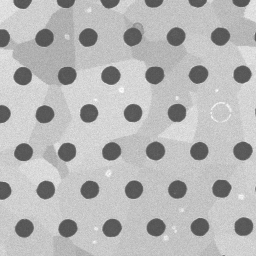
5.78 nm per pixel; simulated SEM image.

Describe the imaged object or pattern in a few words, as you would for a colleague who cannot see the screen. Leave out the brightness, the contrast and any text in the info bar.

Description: a regular array of holes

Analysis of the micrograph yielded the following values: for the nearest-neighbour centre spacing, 252 nanometres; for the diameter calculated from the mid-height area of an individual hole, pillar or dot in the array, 109 nm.